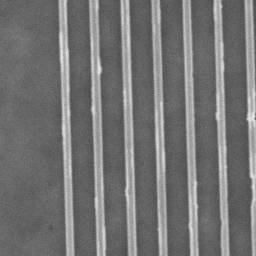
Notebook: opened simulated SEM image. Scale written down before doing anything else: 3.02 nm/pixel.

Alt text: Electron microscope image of parallel lines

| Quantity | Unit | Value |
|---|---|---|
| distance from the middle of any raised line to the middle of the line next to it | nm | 93.5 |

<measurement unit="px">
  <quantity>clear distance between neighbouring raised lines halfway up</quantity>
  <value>23.5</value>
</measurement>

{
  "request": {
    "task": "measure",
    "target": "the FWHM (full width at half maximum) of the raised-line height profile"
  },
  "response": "7.88 pixels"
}